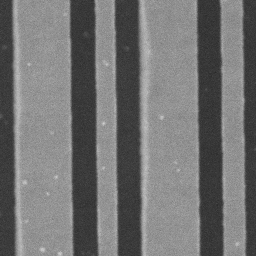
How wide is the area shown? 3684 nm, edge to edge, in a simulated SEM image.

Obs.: lines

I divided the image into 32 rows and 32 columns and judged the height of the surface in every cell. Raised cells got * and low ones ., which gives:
..*******...**...********...**..
..*******...**...********...**..
..*******...**....*******...**..
..*******...**....*******...**..
..*******...**....*******...**..
..*******...**....*******...**..
..*******...**....*******...**..
..*******...**....*******...**..
..*******...**....*******...**..
..*******...**....*******...**..
..*******...**....*******...**..
..*******...**....*******...**..
..*******...**....*******...**..
..*******...**....*******...**..
..*******...**....*******...**..
..*******...**....*******...**..
..*******...**....*******...**..
..*******...**....*******...**..
..*******...**....*******...**..
..*******...**....*******...**..
..*******...**....*******...**..
..*******...**....*******...**..
..*******...**....*******...**..
..*******...***...*******...***.
..*******...***...*******...***.
..*******...***...*******...***.
..*******...***...*******...***.
..*******...***...*******...***.
..*******...***...*******...***.
..*******...***...*******...***.
..*******...***...*******...***.
..*******...***...*******...***.